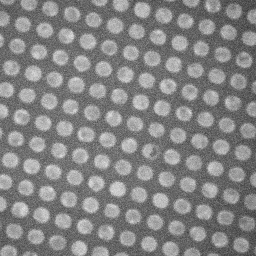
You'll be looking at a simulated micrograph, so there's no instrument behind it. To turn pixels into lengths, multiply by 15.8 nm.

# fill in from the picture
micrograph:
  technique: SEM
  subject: a regular array of raised bodies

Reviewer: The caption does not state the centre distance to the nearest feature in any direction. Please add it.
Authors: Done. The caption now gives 0.35 um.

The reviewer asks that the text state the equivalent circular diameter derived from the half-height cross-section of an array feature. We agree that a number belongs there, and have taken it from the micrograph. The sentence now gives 220 nm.